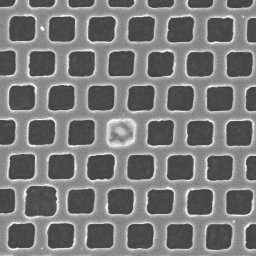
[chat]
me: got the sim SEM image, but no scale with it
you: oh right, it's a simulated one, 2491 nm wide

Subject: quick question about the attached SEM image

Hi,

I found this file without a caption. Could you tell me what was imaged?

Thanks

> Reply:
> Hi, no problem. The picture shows a regular array of holes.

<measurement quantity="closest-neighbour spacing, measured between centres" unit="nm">383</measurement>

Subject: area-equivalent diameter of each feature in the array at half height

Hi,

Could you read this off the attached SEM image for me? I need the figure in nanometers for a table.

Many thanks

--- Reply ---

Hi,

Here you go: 271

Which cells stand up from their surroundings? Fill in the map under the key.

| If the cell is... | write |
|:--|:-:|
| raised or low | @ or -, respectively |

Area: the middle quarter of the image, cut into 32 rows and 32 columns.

@-------@@@-------@@@------@@@--
@-------@@@------@@@@------@@@@-
@------@@@@------@@@@------@@@@-
@@@@@@@@@@@@@@@@@@@@@@@@@@@@@@@@
@@@@@@@@@@@@@@@@@@@@@@@@@@@@@@@@
--@@@@@-----@@@@@@----@@@@@-----
---@@@-------@@@-------@@@------
---@@@-------@@@-------@@@------
---@@@-------@@@-------@@@------
---@@@-------@@@-------@@@------
--@@@@------@@@@------@@@@------
-@@@@@@-----@@@@------@@@@------
@@@@@@@@@@@@@@@@@@@@@@@@@@@@@@@@
@@@@@@@@@@@@@@@@@@@@@@@@@@@@@@@@
@@-----@@@@@@@@@@@@@@@-----@@@@-
@-------@@@@@@@@@@@@@------@@@@-
@-------@@@@@@@@@@@@@------@@@@-
@-------@@@@@@@@@@@@@------@@@@-
@-------@@@@@@@@@@@@@------@@@@-
@------@@@@@@@@@@@@@@------@@@@-
@@@@@@@@@@@@@@@@@@@@@@@@@@@@@@@@
@@@@@@@@@@@@@@@@@@@@@@@@@@@@@@@@
@@@@@@@@@@@@@@@@@@@@@@@@@@@@@@@@
---@@@-------@@@------@@@@------
---@@@-------@@@------@@@@------
---@@@-------@@@------@@@@------
---@@@-------@@@------@@@@------
--@@@@------@@@@------@@@@------
--@@@@------@@@@------@@@@------
@@@@@@@@@@@@@@@@@@@@@@@@@@@@@@@@
@@@@@@@@@@@@@@@@@@@@@@@@@@@@@@@@
@@-----@@@@@-----@@@@@-@---@@@@@